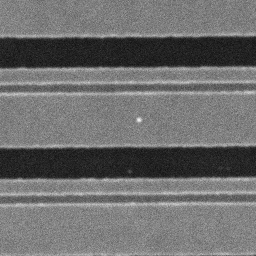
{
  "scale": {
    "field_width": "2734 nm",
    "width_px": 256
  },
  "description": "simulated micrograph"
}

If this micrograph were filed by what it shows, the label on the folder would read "lines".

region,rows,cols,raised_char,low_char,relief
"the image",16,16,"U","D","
UUUUUUUUUUUUUUUU
UUUUUUUUUUUUUUUU
DDDDDDDDDDDDDDDD
DDDDDDDDDDDDDDDD
UUUUUUUUUUUUUUUU
UUUUUUUUUUUUUUUU
UUUUUUUUUUUUUUUU
UUUUUUUUUUUUUUUU
UUUUUUUUUUUUUUUU
DDDDDDDDDDDDDDDD
DDDDDDDDDDDDDDDD
UUUUUUUUUUUUUUUU
UUUUUUUUUUUUUUUU
UUUUUUUUUUUUUUUU
UUUUUUUUUUUUUUUU
UUUUUUUUUUUUUUUU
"